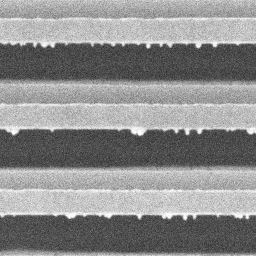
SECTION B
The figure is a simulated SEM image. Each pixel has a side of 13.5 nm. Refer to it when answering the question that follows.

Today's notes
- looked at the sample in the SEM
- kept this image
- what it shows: lines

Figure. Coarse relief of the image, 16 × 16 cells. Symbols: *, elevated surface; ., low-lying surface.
****************
****************
****************
................
................
****************
****************
****************
................
................
................
****************
****************
....*.*...**...*
................
................